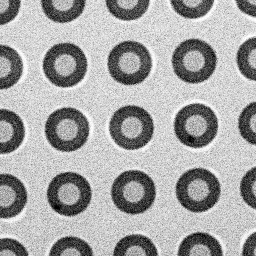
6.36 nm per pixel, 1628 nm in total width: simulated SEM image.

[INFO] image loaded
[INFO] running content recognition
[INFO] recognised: an array of small figures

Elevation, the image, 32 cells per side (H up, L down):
LLLHHLLLLLLHHLLLLLLHHLLLLLLHHLLL
LLLHHLLLLLHHHHLLLLHHHHLLLLHHHHLL
LLHHHHLLLHHHHHHLLHHHHHHHLHHHHHHH
HHHHHHHHHHHHHHHHHHHHHHHHHHHHHHHH
HHHHHHHHHHHHHHHHHHHHHHHHHHHHHHHL
HHHHHHHLLHHHHHHLLLHHHHLLLLHHHHLL
LLHHHHLLLLHHHHLLLLLHHHLLLLLHHHLL
LLLHHLLLLLLHHLLLLLLHHLLLLLLHHLLL
LLLHHLLLLLLHHLLLLLLHHHLLLLLHHHLL
LLLHHHLLLLLHHHLLLLLHHHLLLLHHHHLL
LLHHHHLLLLHHHHHLLHHHHHHHLHHHHHHH
HHHHHHHHHHHHHHHHHHHHHHHHHHHHHHHH
HHHHHHHHHHHHHHHHHHHHHHHHHHHHHHHH
HHHHHHHLLHHHHHHLLLHHHHHLLLHHHHHL
LLHHHHLLLLLHHHLLLLLHHHLLLLLHHHLL
LLLHHHLLLLLHHLLLLLLHHHLLLLLHHHLL
LLLHHHLLLLLHHLLLLLLHHHLLLLLHHHLL
LLLHHHLLLLLHHHLLLLLHHHLLLLLHHHHL
LLHHHHHLLLHHHHHLLLHHHHHHLLHHHHHH
HHHHHHHHHHHHHHHHHHHHHHHHHHHHHHHH
HHHHHHHHHHHHHHHHHHHHHHHHHHHHHHHH
HHHHHHHHLHHHHHHLLLHHHHHLLLLHHHHL
LLLHHHLLLLLHHHLLLLLHHHLLLLLHHHLL
LLLHHHLLLLLHHHLLLLLLHHLLLLLLHHLL
LLLHHHLLLLLHHHLLLLLLHHLLLLLLHHLL
LLLHHHLLLLLHHHLLLLLHHHHLLLLHHHHL
LLLHHHHLLLHHHHHLLLHHHHHHLLHHHHHH
HHHHHHHHHHHHHHHHHHHHHHHHHHHHHHHH
HHHHHHHHHHHHHHHHHHHHHHHHHHHHHHHH
HHHHHHHHLHHHHHHHLLHHHHHLLLLHHHHL
LLLHHHHLLLLHHHHLLLLHHHLLLLLLHHLL
LLLLHHLLLLLLHHLLLLLLHHLLLLLLHHLL